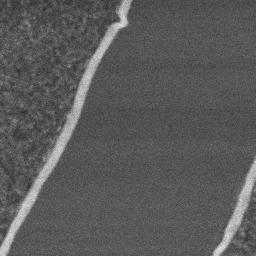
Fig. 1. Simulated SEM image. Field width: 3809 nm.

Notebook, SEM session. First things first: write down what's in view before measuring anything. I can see one or a few lines or trenches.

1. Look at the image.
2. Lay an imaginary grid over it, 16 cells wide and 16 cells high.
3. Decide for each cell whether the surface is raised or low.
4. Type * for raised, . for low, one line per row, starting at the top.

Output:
********........
*******.........
*******.........
******..........
******..........
*****...........
*****...........
*****...........
****............
****............
***.............
**..............
**.............*
*..............*
*.............**
..............**